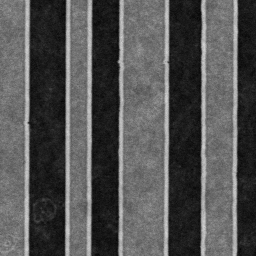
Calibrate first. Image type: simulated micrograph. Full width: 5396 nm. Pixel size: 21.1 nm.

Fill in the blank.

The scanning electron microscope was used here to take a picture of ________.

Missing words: one or a few lines or trenches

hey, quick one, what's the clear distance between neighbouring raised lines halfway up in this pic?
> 782 nanometers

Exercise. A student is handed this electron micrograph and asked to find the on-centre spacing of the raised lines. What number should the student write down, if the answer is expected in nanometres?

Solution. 1480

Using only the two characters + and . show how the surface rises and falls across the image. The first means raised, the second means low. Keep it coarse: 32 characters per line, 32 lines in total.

+++......++....++++++....++++...
+++......++....++++++....++++...
+++......++....++++++....++++...
+++......++....++++++.....+++...
+++......++....++++++....++++...
+++......++....++++++....++++...
+++......++....++++++....++++...
+++......++....++++++....++++...
+++......++....++++++....++++...
+++......++....++++++.....+++...
+++......++....++++++....++++...
+++......++....++++++....++++...
+++......++....++++++.....+++...
+++......++....++++++....++++...
+++......++....++++++....++++...
+++......++....++++++.....+++...
+++......++....++++++.....+++...
+++......++....++++++.....+++...
+++......++....++++++.....+++...
+++......++....++++++....++++...
+++......++....++++++....++++...
+++......++....++++++....++++...
+++......++....++++++....++++...
+++......++....++++++....++++...
+++......++....++++++....++++...
+++......++....++++++....++++...
+++......++....++++++....++++...
+++.....+++....++++++....++++...
+++.....+++....++++++....++++...
+++.....+++....++++++....++++...
+++.....+++....++++++....++++...
+++.....+++....++++++....++++...